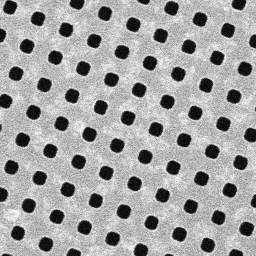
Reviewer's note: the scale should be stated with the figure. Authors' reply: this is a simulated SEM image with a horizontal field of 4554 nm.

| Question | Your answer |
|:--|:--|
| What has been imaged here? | a regular array of holes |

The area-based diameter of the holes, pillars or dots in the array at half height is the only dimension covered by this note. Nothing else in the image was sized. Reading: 0.27 micrometres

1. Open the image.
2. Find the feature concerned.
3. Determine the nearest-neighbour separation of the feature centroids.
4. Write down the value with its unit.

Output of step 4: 525 nanometres